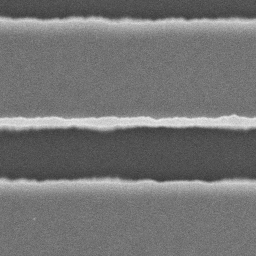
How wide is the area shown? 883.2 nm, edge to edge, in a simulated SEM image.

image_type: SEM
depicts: lines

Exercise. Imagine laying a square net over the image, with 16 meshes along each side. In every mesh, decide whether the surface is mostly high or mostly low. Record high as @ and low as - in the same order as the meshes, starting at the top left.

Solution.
----------------
@@@@@@@@@@@@@@@@
@@@@@@@@@@@@@@@@
@@@@@@@@@@@@@@@@
@@@@@@@@@@@@@@@@
@@@@@@@@@@@@@@@@
@@@@@@@@@@@@@@@@
@@@@@@@@@@@@@@@@
----------------
----------------
----------------
@@@@@@@@@@@@@@@@
@@@@@@@@@@@@@@@@
@@@@@@@@@@@@@@@@
@@@@@@@@@@@@@@@@
@@@@@@@@@@@@@@@@